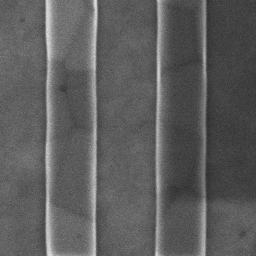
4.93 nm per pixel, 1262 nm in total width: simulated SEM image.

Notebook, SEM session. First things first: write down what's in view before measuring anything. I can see wiring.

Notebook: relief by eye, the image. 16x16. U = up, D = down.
DDDUUDDDDDUUUDDD
DDDUUUDDDDUUUDDD
DDDUUUDDDDUUUDDD
DDDUUUDDDDUUDDDD
DDDUUUDDDDDUUDDD
DDDUUUDDDDUUUDDD
DDDUUUDDDDUUUDDD
DDDUUUDDDDUUUDDD
DDDUUUDDDDUUUDDD
DDDUUUDDDDUUUDDD
DDDUUUDDDDUUUDDD
DDDUUUDDDDUUUDDD
DDDUUUDDDDUUUDDD
DDDUUUDDDDUUUDDD
DDDUUUDDDDUUUDDD
DDDUUUDDDDUUUDDD